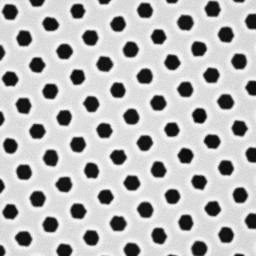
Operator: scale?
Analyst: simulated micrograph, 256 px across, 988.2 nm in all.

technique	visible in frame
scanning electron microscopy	a regular array of holes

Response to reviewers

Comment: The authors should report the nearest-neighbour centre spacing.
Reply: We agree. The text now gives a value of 114 nm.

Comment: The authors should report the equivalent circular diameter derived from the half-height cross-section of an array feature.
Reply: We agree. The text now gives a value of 62.4 nm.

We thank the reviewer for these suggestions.